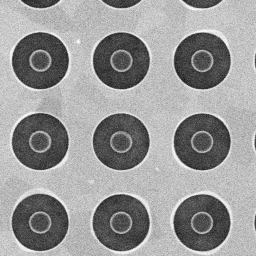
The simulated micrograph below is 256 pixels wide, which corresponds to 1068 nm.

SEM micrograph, an array of small figures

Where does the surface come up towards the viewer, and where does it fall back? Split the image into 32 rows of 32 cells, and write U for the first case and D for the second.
UUUDDDDUUUUUUDDDDUUUUUUDDDDUUUUU
UUUUUUUUUUUUUUUUUUUUUUUUUUUUUUUU
UUUUUUUUUUUUUUUUUUUUUUUUUUUUUUUU
UUUUUUUUUUUUUUUUUUUUUUUUUUUUUUUU
UUUDDDDUUUUUUDDDDUUUUUUDDDDDUUUU
UUDDDDDDUUUUDDDDDDUUUUDDDDDDUUUU
UUDDDUDDDUUUDDDUDDDUUUDDDUDDDUUU
UDDDUUDDDUUDDDUUDDDUUUDDUUUDDUUU
UUDDUUDDDUUUDDUUDDDUUUDDUUDDDUUU
UUDDDDDDUUUUDDDDDDUUUUDDDDDDUUUU
UUUDDDDUUUUUUDDDDUUUUUUDDDDUUUUU
UUUUUUUUUUUUUUUUUUUUUUUUUUUUUUUU
UUUUUUUUUUUUUUUUUUUUUUUUUUUUUUUU
UUUUUUUUUUUUUUUUUUUUUUUUUUUUUUUU
UUUDDDDUUUUUUUDDDUUUUUUUDDDUUUUU
UUDDDDDDUUUUDDDDDDUUUUDDDDDDUUUU
UUDDDDDDUUUUDDDDDDDUUUDDDUDDDUUU
UDDDUUDDDUUUDDDDDDDUUUDDUUUDDUUU
UDDDUUDDDUUUDDDDDDDUUUDDUUDDDUUU
UUDDDDDDUUUUDDDDDDUUUUDDDDDDUUUU
UUUDDDDDUUUUUDDDDUUUUUUDDDDDUUUU
UUUUUUUUUUUUUUUUUUUUUUUUUUUUUUUU
UUUUUUUUUUUUUUUUUUUUUUUUUUUUUUUU
UUUUUUUUUUUUUUUUUUUUUUUUUUUUUUUU
UUUDDDDUUUUUUUDDDUUUUUUUDDDUUUUU
UUDDDDDDUUUUDDDDDDUUUUDDDDDDUUUU
UUDDDDDDUUUUDDDDDDDUUUDDDDDDDUUU
UDDDUUDDDUUDDDUUDDDUUDDDUUDDDUUU
UUDDUUDDDUUUDDUUDDDUUUDDUUDDDUUU
UUDDDDDDUUUUDDDDDDUUUUDDDDDDUUUU
UUDDDDDUUUUUUDDDDDUUUUUDDDDDUUUU
UUUUUUUUUUUUUUUDUUUUUUUUUDUUUUUU